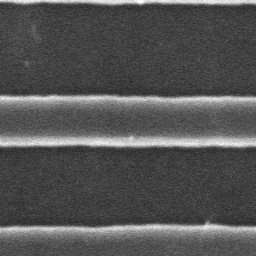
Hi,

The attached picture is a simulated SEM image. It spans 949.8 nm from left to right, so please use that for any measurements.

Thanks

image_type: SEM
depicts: lines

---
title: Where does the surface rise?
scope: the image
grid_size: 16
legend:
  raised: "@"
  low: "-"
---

----------------
----------------
----------------
----------------
----------------
----------------
@@@@@@@@@@@@@@@@
@@@@@@@@@@@@@@@@
@@@@@@@@@@@@@@@@
----------------
----------------
----------------
----------------
----------------
@@@@@@@@@@@@@@@@
@@@@@@@@@@@@@@@@